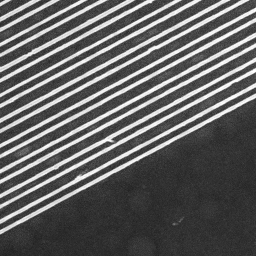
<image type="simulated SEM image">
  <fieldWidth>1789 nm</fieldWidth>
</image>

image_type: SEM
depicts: parallel lines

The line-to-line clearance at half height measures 44.7 nanometres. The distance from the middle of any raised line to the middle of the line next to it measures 77.1 nanometers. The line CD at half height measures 2.76 px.